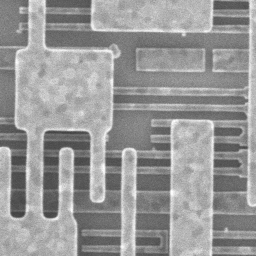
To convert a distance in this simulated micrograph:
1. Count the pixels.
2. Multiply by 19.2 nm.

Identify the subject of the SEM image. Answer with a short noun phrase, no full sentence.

wiring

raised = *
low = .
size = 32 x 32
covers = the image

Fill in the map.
....**.....****************....*
....**.....****************....*
....**.....****************....*
....**......**************.....*
....**.........................*
....**.........................*
..************.................*
..************.................*
..************.................*
..************.................*
..************.................*
..************.................*
..************.................*
..************.................*
..************.................*
..************.......******....*
...***.....**........******....*
....*......**........******....*
*..**......**........******....*
*..**..**..**..**....******....*
*..**..**..**..**....******....*
*..**..**..**..**....******....*
*..**..**..**..**....******....*
*..**..**..**..**....******....*
*..**..**..**..**....******....*
*..**..**......**....******....*
*..**..**......**....******.....
*********......**....******.....
**********.....**....******.....
**********.....**....*****......
**********.....**....*****......
**********.....**....*****......